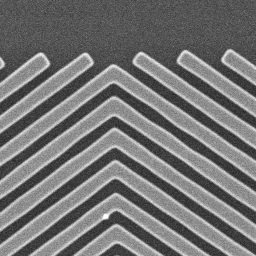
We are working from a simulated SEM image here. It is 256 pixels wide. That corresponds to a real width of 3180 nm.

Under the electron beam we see groups of lines, slits or small figures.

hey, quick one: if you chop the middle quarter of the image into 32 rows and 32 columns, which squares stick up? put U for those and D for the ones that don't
DUUUUUUDDDDDUDDDDDUUUUUUDDDDDUUU
UUUUUDDDDDUUUUUDDDDDUUUUUUDDDDDU
UUUUDDDDDUUUUUUUDDDDDUUUUUUDDDDD
UUUDDDDDUUUUUUUUUUDDDDDUUUUUUDDD
UDDDDDUUUUUUUUUUUUUDDDDDUUUUUUDD
DDDDDUUUUUUDDDUUUUUUDDDDDUUUUUUU
DDDDUUUUUUDDDDDUUUUUUUDDDDDUUUUU
DDUUUUUUDDDDDDDDDUUUUUUDDDDDUUUU
DUUUUUUDDDDDUDDDDDUUUUUUUDDDDDUU
UUUUUDDDDDUUUUUDDDDDUUUUUUDDDDDU
UUUUDDDDDUUUUUUUDDDDDUUUUUUUDDDD
UUUDDDDDUUUUUUUUUUDDDDDUUUUUUDDD
UUDDDDUUUUUUUUUUUUUDDDDDUUUUUUUD
DDDDDUUUUUUDDDUUUUUUDDDDDDUUUUUU
DDDDUUUUUUDDDDDUUUUUUUDDDDDUUUUU
DDUUUUUUUDDDDDDDDUUUUUUUDDDDUUUU
DUUUUUUDDDDDUUDDDDUUUUUUUDDDDDUU
UUUUUUDDDDUUUUUDDDDDUUUUUUUDDDDU
UUUUDDDDDUUUUUUUUDDDDUUUUUUUDDDD
UUUDDDDDUUUUUUUUUUDDDDDUUUUUUDDD
UUDDDDDUUUUUUUUUUUUDDDDDUUUUUUDD
UDDDDUUUUUUDDDUUUUUUUDDDDDUUUUUU
DDDDUUUUUUDDDDDDUUUUUUDDDDDUUUUU
DDUUUUUUUDDDDDDDDUUUUUUUDDDDDUUU
DUUUUUUDDDDDUUDDDDDUUUUUUDDDDDUU
UUUUUUDDDDDUUUUDDDDDUUUUUUDDDDDD
UUUUDDDDDUUUUUUUUDDDDDUUUUUUDDDD
UUUDDDDDUUUUUUUUUUDDDDDUUUUUUDDD
UUDDDDDUUUUUUUUUUUUUDDDDUUUUUUUD
UDDDDUUUUUUDDDDUUUUUUDDDDDUUUUUU
DDDDUUUUUUDDDDDDUUUUUUUDDDDDUUUU
DDDUUUUUUDDDDDDDDUUUUUUUDDDDDUUU